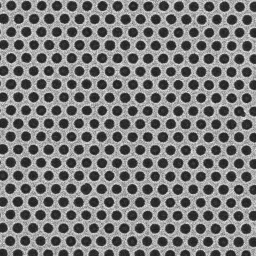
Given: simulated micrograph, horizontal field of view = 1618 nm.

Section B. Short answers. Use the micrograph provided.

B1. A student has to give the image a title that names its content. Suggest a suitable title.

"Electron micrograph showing a regular array of holes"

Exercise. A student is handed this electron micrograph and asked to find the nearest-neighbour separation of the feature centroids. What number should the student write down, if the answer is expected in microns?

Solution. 0.0926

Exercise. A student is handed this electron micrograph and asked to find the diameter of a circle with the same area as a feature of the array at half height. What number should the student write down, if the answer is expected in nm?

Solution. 63.7